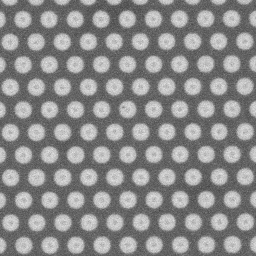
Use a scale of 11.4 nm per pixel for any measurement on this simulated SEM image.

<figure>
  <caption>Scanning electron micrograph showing an array of small figures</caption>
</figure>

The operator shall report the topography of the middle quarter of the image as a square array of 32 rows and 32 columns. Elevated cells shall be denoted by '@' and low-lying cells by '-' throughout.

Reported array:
-@@@@--@@@@---@@@@--@@@@---@@@@-
-@@@----@@@---@@@----@@@---@@@--
--------------------------------
--------------------------------
@----@@@---@@@----@@@---@@@----@
@@--@@@@---@@@@--@@@@---@@@@--@@
@---@@@@---@@@@--@@@@---@@@@--@@
@----@@-----@@----@@-----@@----@
--------------------------------
--@@-----@-----@@-----@-----@@--
-@@@@---@@@---@@@@---@@@---@@@@-
-@@@@--@@@@---@@@@--@@@@---@@@@-
-@@@@---@@@---@@@@---@@@---@@@@-
--------------------------------
--------------------------------
@----@@----@@@----@@@---@@@----@
@@--@@@@---@@@@--@@@@---@@@@--@@
@@--@@@@---@@@@--@@@@---@@@@--@@
@----@@@---@@@----@@@---@@@----@
--------------------------------
--------------------------------
-@@@@---@@@---@@@@---@@@---@@@@-
-@@@@--@@@@---@@@@--@@@@---@@@@-
-@@@@---@@@---@@@@---@@@---@@@@-
--@@-----@-----@@-----@-----@@--
--------------------------------
@----@@-----@@----@@-----@@----@
@@--@@@@---@@@@--@@@@---@@@@--@@
@@--@@@@---@@@@--@@@@---@@@@--@@
@----@@@---@@@----@@@---@@@----@
--------------------------------
--------------------------------